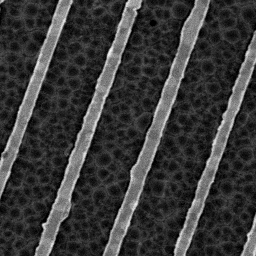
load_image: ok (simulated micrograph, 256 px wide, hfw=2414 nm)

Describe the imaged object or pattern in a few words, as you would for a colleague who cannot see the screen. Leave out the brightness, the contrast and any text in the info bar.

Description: one or a few lines or trenches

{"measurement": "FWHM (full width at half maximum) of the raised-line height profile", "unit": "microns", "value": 0.112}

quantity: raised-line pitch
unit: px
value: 64.3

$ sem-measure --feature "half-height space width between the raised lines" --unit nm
498